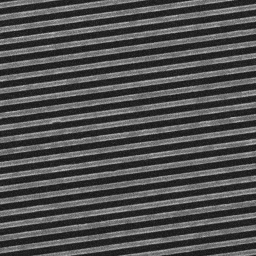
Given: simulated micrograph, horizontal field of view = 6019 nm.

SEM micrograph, parallel lines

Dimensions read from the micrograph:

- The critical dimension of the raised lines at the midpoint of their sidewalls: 114 nm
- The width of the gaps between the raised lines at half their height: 0.157 µm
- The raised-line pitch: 0.285 µm